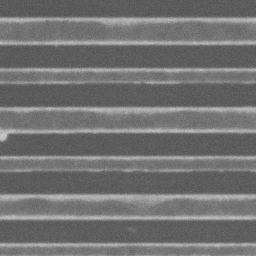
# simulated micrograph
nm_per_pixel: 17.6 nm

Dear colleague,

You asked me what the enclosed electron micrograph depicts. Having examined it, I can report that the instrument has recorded lines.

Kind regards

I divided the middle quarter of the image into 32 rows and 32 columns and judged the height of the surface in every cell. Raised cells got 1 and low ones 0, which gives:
00000000000000000000000000000000
11111111111111111111111111101111
11111111111111111111111111111111
11111111111111111111111111111111
11111111111111111111111111111111
00000000000000000000000000000000
00000000000000000000000000000000
00000000000000000000000000000000
00000000000000000000000000000000
00000000000000000000000000000000
00000000000000000000000000000000
11111111111111111111111111111111
11111111111111111111111111111111
11111111111111111111111111111111
11111111111111111111111111111111
11111111111111111111111111111111
11111111111111111111111111111111
00000000000000000000000000000000
00000000000000000000000000000000
00000000000000000000000000000000
00000000000000000000000000000000
00000000000000000000000000000000
00000000000000000000000000000000
11111111111111111111111111111111
11111111111111111111111111111111
11111111111111111111111111111111
00000011100000011100111111111111
00000000000000000000000000000000
00000000000000000000000000000000
00000000000000000000000000000000
00000000000000000000000000000000
00000000000000000000000000000000